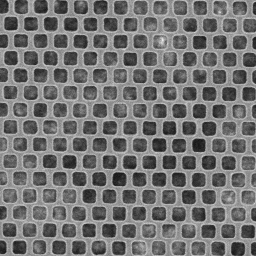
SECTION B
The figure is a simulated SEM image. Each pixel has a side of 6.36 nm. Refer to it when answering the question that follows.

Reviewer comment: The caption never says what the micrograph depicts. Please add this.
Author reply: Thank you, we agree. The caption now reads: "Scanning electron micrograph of a regular array of holes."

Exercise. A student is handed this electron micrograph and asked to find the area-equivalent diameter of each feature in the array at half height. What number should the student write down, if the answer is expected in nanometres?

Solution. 97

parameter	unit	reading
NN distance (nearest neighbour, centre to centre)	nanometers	124